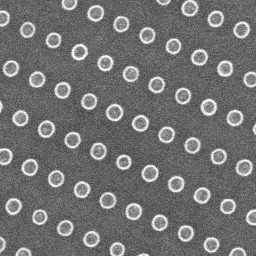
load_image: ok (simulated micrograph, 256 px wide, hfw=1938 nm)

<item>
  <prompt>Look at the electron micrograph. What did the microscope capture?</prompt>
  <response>a regular array of raised bodies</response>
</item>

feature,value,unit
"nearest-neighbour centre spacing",28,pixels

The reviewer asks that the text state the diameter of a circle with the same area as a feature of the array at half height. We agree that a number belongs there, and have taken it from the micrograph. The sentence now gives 111 nanometres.